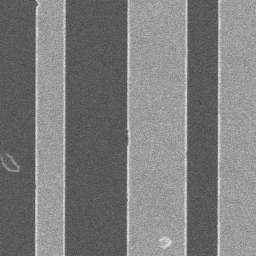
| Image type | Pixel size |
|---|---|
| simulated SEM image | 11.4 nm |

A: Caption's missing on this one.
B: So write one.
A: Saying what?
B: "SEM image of one or a few lines or trenches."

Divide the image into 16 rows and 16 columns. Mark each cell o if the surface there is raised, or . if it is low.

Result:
..oo....oooo..oo
..oo....oooo..oo
..oo....oooo..oo
..oo....oooo..oo
..oo....oooo..oo
..oo....oooo..oo
..oo....oooo..oo
..oo....oooo..oo
..oo....oooo..oo
..oo....oooo..oo
..oo....oooo..oo
..oo....oooo..oo
..oo....oooo..oo
..oo....oooo..oo
..oo....oooo..oo
..oo....oooo..oo